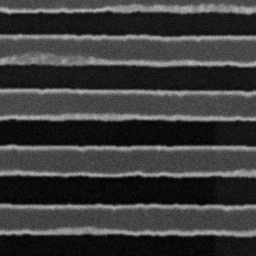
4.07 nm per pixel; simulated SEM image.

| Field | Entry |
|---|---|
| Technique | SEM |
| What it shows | lines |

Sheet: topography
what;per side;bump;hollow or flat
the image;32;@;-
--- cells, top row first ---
@@@@@@@@@@@@@@@@@@@@@@@@@@@@@@@@
--------------------------------
--------------------------------
--------------------------------
--@-----------------------------
@@@@@@@@@@@@@@@@@@@@@@@@@@@@@@@@
@@@@@@@@@@@@@@@@@@@@@@@@@@@@@@@@
@@@---@@@@@@@@@@@@@@@@@@@@@@@@@@
--------------------------------
--------------------------------
--------------------------------
@@@@@@@@@@@@@@@@@@-@------------
@@@@@@@@@@@@@@@@@@@@@@@@@@@@@@@@
@@@@@@@@@@@@@@@@@@@@@@@@@@@@@@@@
@@@@@@@@@@@@@@@@@@@@@@@@@@@@@@@@
--------------------------------
--------------------------------
--------------------------------
@@@@@@@@@@@@@@@-@@@@@@@@@@@@@@@-
@@@@@@@@@@@@@@@@@@@@@@@@@@@@@@@@
@@@@@@@@@@@@@@@@@@@@@@@@@@@@@@@@
@@@@@@@@@@@@@@@@@@@@@@@@@@@@@@@@
--------------------------------
--------------------------------
--------------------------------
--------------------------------
@@@@@@@@@@@@@@@@@@@@@@@@@@@@@@@@
@@@@@@@@@@@@@@@@@@@@@@@@@@@@@@@@
@@@@@@@@@@@@@@@@@@@@@@@@@@@@@@@@
--------------------------------
--------------------------------
--------------------------------